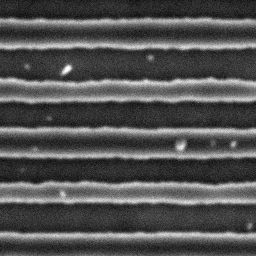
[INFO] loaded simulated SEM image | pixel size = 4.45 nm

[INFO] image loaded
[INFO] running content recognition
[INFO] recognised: lines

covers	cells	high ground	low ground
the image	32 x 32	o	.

................................
................................
ooo.oo.......o.ooooooooooooo..o.
oooooooooooooooooooooooooooooooo
oooooooooooooooooooooooooooooooo
oooooooooooooooooooooooooooooooo
................................
................................
................................
................................
oooooooooooooooooooooooooooooooo
oooooooooooooooooooooooooooooooo
oooooooooooooooo.oo.ooo.oooooooo
................................
................................
................................
oooooooooooooooooooooooooooooooo
oooooooooooooooooooooooooooooooo
oooooooooooooooooooooooooooooooo
oooooooooooooooooooooooooooooooo
................................
................................
................................
oooooooooooooooooooooooooooooooo
oooooooooooooooooooooooooooooooo
................................
................................
................................
................................
oooooooooooooooooooooooooooooooo
oooooooooooooooooooooooooooooooo
oooooooooooooooooooooooooooooooo